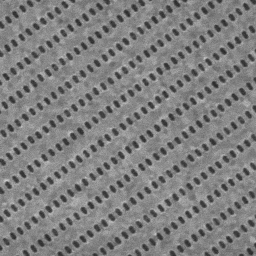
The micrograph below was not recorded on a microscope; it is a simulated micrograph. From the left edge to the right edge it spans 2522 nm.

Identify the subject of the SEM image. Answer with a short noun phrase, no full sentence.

a regular array of holes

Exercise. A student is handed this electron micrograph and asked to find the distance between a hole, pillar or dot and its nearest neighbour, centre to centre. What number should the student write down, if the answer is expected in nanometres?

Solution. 86